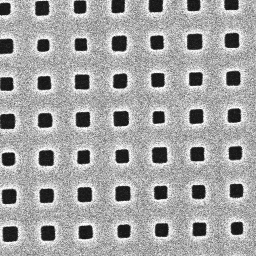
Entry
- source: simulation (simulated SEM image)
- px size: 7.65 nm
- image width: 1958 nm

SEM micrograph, a regular array of holes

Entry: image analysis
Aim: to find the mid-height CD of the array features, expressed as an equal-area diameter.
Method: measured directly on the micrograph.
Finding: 119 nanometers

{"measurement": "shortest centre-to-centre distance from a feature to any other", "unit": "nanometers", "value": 286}